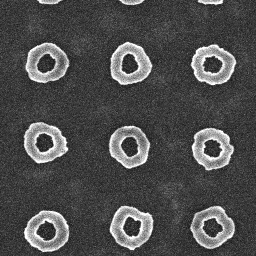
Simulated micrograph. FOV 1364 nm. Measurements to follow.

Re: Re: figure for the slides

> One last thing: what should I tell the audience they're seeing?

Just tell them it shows a regular array of ring-shaped raised bodies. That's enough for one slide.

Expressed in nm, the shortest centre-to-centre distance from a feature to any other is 431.